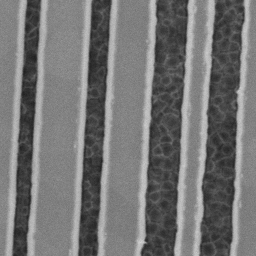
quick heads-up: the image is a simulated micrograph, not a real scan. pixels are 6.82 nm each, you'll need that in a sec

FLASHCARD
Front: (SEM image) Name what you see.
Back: one or a few lines or trenches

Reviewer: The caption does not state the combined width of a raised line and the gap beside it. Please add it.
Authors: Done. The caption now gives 0.46 um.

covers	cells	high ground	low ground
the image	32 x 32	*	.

***..******...*****.....**.....*
***..******...*****.....**.....*
***..******...*****.....**.....*
***..******...*****.....**.....*
***..******...*****.....**.....*
***..******...*****.....**.....*
***..******...*****.....**....**
***..******...*****.....**....**
**...******...*****....***....**
**...******...*****....***....**
**...******...*****....***....**
**...*****....*****....***....**
**...*****....*****....***....**
**...*****....*****....***....**
**...*****...*****.....***....**
**...*****...*****.....***....**
**...*****...*****.....***....**
**...*****...*****.....**.....**
**..******...*****.....**.....**
**..******...*****.....**.....**
**..******...*****.....**.....**
**..******...*****.....**.....**
**..******...*****.....**.....**
**..******...*****.....**.....**
**..******...*****.....**.....**
**..******...*****.....**....***
**..******...*****....***....***
*...******...*****.....**....***
*...******...*****....***....***
*...*****....*****....***....***
*...*****....*****....***....***
*...*****....****.....***....***